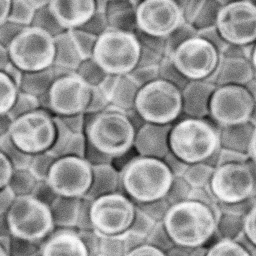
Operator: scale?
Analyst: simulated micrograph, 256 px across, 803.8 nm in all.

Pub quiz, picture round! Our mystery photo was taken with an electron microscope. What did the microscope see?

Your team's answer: a regular array of raised bodies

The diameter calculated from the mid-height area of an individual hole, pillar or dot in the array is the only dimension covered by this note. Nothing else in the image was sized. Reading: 128 nanometers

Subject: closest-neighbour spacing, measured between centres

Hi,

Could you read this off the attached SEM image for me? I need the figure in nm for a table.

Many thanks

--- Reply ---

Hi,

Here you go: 176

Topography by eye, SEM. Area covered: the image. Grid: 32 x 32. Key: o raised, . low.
o......ooooo......oooo.......oo.
o......ooooo.....ooooo......oooo
........ooo......ooooo.....ooooo
..................oooo.....ooooo
..oooo.......ooo............oooo
.oooooo.....ooooo......ooo......
.oooooo.....ooooo.....ooooo.....
..oooo......ooooo.....ooooo.....
...oo........oooo.....ooooo.....
o.......................o.......
oo.....oooo........oo...........
oo....ooooo......ooooo.....oooo.
oo....ooooo......oooooo...ooooo.
o......oooo......oooooo...oooooo
...oo........oo...oooo.....oooo.
..ooooo.....oooo.......ooo......
..ooooo....oooooo.....ooooo.....
..ooooo....oooooo....oooooo.....
...ooo......oooo......ooooo.....
......................oooo......
o......oooo......ooo............
o.....ooooo.....ooooo......oooo.
o.....ooooo.....ooooo......oooo.
.......oooo.....ooooo......oooo.
.............oo..ooo.......oooo.
..ooo.......oooo.......oo.......
.ooooo.....oooooo....ooooo.....o
.ooooo......ooooo....oooooo....o
.ooooo......oooo.....oooooo....o
..ooo..oo............ooooo.....o
......oooo.............oo..oo...
o.....ooooo......ooo......ooooo.